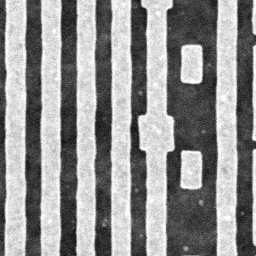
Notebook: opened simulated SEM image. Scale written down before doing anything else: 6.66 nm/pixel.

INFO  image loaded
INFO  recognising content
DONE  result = wiring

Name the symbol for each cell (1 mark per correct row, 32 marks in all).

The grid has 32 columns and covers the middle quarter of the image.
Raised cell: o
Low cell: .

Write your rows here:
...ooooo....ooooo....ooooo....oo
...ooooo....ooooo....ooooo...ooo
....oooo....ooooo....ooooo...ooo
...ooooo....ooooo....oooo....ooo
...ooooo....ooooo....oooo......o
...ooooo....oooo.....oooo.......
...ooooo....oooo.....oooo.......
...ooooo....oooo.....oooo.......
...ooooo....oooo.....oooo.......
...ooooo....oooo.....oooo.......
...ooooo....oooo.....oooo.......
...ooooo....oooo.....oooo.......
...ooooo....ooooo....ooooo......
...ooooo....ooooo..oooooooo.....
...ooooo....oooo...oooooooo.....
...oooo.....oooo...oooooooo.....
...oooo.....oooo...oooooooo.....
...oooo.....oooo...oooooooo.....
...ooooo....oooo...oooooooo.....
...ooooo....oooo...oooooooo.....
...ooooo....oooo...oooooooo.....
...ooooo....oooo....ooooooo.....
...ooooo....oooo.....ooooo...ooo
...ooooo....oooo.....oooo....ooo
....ooo.....oooo.....oooo.....oo
...oooo.....oooo.....oooo.....oo
...oooo.....oooo.....oooo....ooo
...ooooo....oooo.....oooo....ooo
....oooo....oooo.....oooo....ooo
....oooo....oooo.....oooo....ooo
....oooo....oooo.....oooo....ooo
...ooooo....oooo.....oooo.......